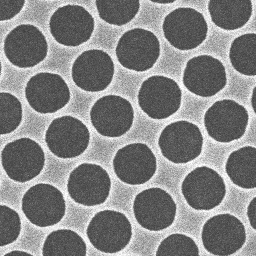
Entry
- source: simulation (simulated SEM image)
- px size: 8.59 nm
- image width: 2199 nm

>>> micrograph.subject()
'a regular array of holes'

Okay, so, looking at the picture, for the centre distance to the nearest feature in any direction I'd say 427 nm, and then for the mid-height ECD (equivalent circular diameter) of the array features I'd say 373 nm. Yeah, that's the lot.